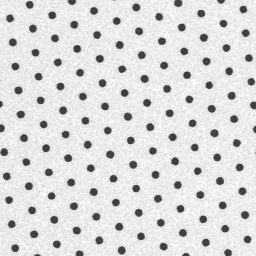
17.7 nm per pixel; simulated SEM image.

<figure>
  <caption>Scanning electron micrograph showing a regular array of holes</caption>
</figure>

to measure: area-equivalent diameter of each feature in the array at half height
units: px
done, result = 8.06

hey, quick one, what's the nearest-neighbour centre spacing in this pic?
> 421 nm